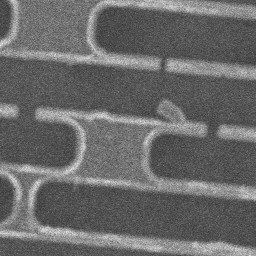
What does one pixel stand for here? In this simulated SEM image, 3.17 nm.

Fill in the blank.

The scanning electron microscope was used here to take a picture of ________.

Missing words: parallel lines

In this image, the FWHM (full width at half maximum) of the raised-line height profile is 29.5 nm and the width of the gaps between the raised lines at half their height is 160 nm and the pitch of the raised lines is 188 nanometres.